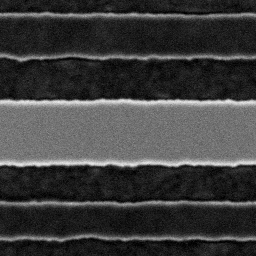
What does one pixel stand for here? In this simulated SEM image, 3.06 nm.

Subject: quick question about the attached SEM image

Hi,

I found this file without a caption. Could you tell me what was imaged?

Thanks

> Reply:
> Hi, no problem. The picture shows lines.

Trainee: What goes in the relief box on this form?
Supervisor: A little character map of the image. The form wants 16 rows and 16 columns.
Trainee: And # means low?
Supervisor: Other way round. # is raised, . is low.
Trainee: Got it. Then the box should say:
................
################
################
################
................
................
################
################
################
################
................
................
................
################
################
................